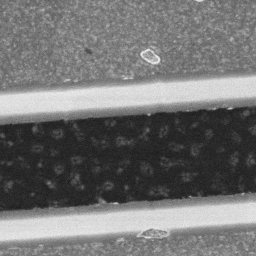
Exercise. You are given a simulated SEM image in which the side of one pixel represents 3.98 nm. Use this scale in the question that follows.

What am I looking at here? one or a few lines or trenches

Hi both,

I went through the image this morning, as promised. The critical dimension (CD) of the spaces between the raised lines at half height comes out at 0.508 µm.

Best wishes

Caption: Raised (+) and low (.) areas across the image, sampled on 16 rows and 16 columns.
++++++++++++++++
++++++++++++++++
++++++++++++++++
++++++++++++++++
++++++++++++++++
++++++++++++++..
................
................
................
................
................
................
................
..............++
++++++++++++++++
++++++++++++++++